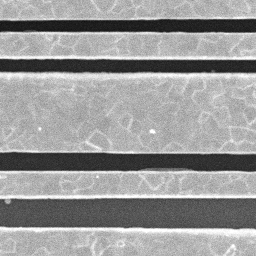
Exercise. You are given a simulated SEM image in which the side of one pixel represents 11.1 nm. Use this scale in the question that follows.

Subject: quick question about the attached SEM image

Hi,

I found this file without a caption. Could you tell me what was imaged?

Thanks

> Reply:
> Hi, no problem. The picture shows lines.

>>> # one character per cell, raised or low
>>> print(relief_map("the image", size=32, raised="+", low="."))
++++++++++++++++++++++++++++++++
++++++++++++++++++++++++++++++++
++++.+..........................
................................
++++++++++++++++++++++++++++++++
++++++++++++++++++++++++++++++++
++++++++++++++++++++++++++++++++
................................
................................
++++++++++++++++++++++++++++++++
++++++++++++++++++++++++++++++++
++++++++++++++++++++++++++++++++
++++++++++++++++++++++++++++++++
++++++++++++++++++++++++++++++++
++++++++++++++++++++++++++++++++
++++++++++++++++++++++++++++++++
++++++++++++++++++++++++++++++++
++++++++++++++++++++++++++++++++
++++++++++++++++++++++++++++++++
................................
................................
+++++++++++++++++++++++++++++++.
++++++++++++++++++++++++++++++++
++++++++++++++++++++++++++++++++
++++++++++++++++++++++++++++++++
................................
................................
................................
+...............................
++++++++++++++++++++++++++++++++
++++++++++++++++++++++++++++++++
++++++++++++++++++++++++++++++++